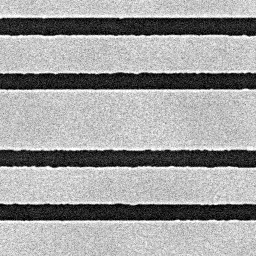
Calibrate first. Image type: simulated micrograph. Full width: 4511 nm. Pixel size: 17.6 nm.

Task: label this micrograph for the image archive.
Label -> lines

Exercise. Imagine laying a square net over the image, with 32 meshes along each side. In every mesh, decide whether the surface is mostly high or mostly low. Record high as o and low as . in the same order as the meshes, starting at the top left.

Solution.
oooooooooooooooooooooooooooooooo
oooooooooooooooooooooooooooooooo
................................
................................
oooooo.ooooooo.ooo.oooooooooo.o.
oooooooooooooooooooooooooooooooo
oooooooooooooooooooooooooooooooo
oooooooooooooooooooooooooooooooo
oooooooooooooooooooooooooooooooo
................................
................................
oooooooooooooooooooooooooooooooo
oooooooooooooooooooooooooooooooo
oooooooooooooooooooooooooooooooo
oooooooooooooooooooooooooooooooo
oooooooooooooooooooooooooooooooo
oooooooooooooooooooooooooooooooo
oooooooooooooooooooooooooooooooo
oooooooooooooooooooooooooooooooo
................................
................................
oooooooooooooooooooooooooooooooo
oooooooooooooooooooooooooooooooo
oooooooooooooooooooooooooooooooo
oooooooooooooooooooooooooooooooo
................o........oo.....
................................
................................
oooooooooooooooooooooooooooooooo
oooooooooooooooooooooooooooooooo
oooooooooooooooooooooooooooooooo
oooooooooooooooooooooooooooooooo